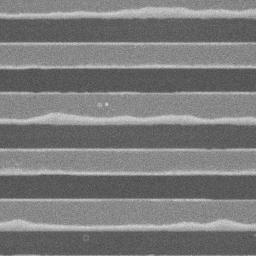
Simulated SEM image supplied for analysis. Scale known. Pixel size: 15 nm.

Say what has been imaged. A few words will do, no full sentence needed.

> lines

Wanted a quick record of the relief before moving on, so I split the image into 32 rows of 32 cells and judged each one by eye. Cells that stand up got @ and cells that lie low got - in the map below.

@@@@@@@@@@@@@@@@@@@@@@@@@@@@@@@@
@@@@@@@@@@@@@@@@@@@@@@@@@@@@@@@@
--------------------------------
--------------------------------
--------------------------------
@@@@@@@@@@@@@@@@@@@@@@@@@@@@@@@@
@@@@@@@@@@@@@@@@@@@@@@@@@@@@@@@@
@@@@@@@@@@@@@@@@@@@@@@@@@@@@@@@@
@@@@----------------------------
--------------------------------
--------------------------------
--------------------------------
@@@@@@@@@@@@@@@@@@@@@@@@@@@@@@@@
@@@@@@@@@@@@@@@@@@@@@@@@@@@@@@@@
@@@@@@@@@@@@@@@@@@@@@@@@@@@@@@@@
--------------------------------
--------------------------------
--------------------------------
--------------------------------
@@@@@@@@@@@@@@@@@@@@@@@@@@@@@@@@
@@@@@@@@@@@@@@@@@@@@@@@@@@@@@@@@
@@@@@@@@@@@@@@@@@@@@@@@@@@@@@@@@
--------------------------------
--------------------------------
--------------------------------
@@@@@@@@@@@@@@@@@@@@@@@@@@@@@@@@
@@@@@@@@@@@@@@@@@@@@@@@@@@@@@@@@
@@@@@@@@@@@@@@@@@@@@@@@@@@@@@@@@
----@@@@@@@@@@@@@@@@@@--------@@
--------------------------------
--------------------------------
--------------------------------